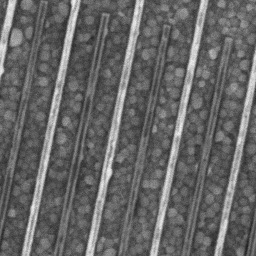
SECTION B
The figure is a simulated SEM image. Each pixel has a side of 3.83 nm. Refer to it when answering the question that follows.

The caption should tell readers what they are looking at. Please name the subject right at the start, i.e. parallel lines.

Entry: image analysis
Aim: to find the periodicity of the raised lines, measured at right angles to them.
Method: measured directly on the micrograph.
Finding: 120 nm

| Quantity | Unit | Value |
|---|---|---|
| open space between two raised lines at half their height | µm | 0.0962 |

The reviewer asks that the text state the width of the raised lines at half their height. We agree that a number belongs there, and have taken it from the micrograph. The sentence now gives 22.6 nm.